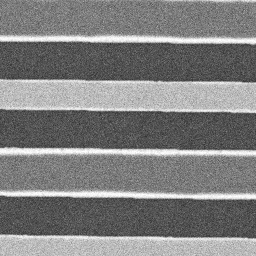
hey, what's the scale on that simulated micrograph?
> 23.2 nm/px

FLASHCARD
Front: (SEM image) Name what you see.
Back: lines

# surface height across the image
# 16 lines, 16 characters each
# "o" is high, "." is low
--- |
oooooooooooooooo
oooooooooooooooo
.......ooooooooo
................
................
oooooooooooooooo
oooooooooooooooo
................
................
oooooooooooooooo
oooooooooooooooo
oooooooooooooooo
................
................
................
oooooooooooooooo